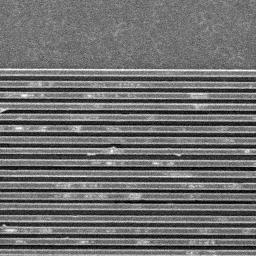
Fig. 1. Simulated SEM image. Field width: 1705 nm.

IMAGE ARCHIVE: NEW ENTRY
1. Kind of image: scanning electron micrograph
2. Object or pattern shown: parallel lines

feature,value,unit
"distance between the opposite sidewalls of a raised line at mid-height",43.3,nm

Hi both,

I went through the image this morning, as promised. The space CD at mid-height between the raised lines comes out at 4.74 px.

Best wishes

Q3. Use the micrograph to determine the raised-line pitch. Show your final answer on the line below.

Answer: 75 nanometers